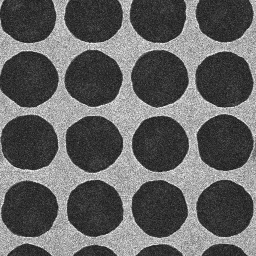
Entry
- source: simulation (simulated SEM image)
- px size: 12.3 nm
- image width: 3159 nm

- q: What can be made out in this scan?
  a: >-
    a regular array of holes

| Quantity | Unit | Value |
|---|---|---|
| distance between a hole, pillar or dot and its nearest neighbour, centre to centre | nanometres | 795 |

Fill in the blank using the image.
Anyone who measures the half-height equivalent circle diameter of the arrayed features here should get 701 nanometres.